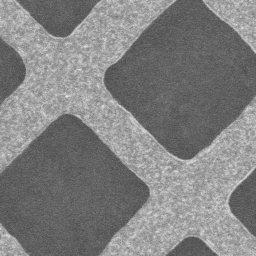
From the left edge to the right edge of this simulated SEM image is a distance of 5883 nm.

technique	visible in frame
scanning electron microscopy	holes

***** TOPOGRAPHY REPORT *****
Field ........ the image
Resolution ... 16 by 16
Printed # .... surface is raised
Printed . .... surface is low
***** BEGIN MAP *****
#.....####...###
##...####.....##
########.......#
.#######........
..#####.........
.######.........
#######.........
###..###.......#
##....###.....##
#......####..###
........########
.........######.
.........#####..
........#######.
.......#########
#......####..###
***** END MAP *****